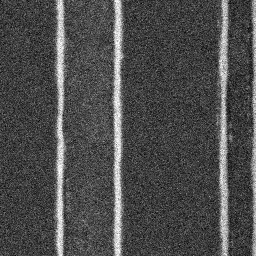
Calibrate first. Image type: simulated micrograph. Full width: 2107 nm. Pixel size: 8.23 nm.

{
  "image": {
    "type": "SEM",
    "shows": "one or a few lines or trenches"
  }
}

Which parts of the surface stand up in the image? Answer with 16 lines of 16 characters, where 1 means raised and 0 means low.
1111000111111100
1111000111111100
1111000111111100
1111000111111100
1111000111111100
1111000111111100
1111000111111100
1111000111111100
1111000111111100
1111000111111100
1111000111111100
1111000111111100
1111000111111100
1111000111111100
1111000111111100
1111000111111100